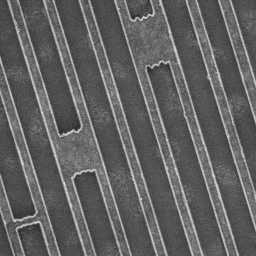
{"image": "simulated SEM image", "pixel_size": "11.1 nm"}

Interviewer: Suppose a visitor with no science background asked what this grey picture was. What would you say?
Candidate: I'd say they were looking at parallel lines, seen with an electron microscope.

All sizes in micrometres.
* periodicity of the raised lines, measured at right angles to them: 0.379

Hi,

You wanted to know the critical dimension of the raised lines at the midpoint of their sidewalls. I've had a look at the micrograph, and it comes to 109 nanometres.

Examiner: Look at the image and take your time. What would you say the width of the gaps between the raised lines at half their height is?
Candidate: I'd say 0.269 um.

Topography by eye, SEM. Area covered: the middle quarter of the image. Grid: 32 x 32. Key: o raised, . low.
oo.......oo.......oooo.....oo...
ooo......ooo......ooo......ooo..
ooo.......oo......ooo......ooo..
.oo.......oo.......oo.......oo..
.ooo......ooo......ooo......oo..
.ooo......ooo......ooo......ooo.
..oo.......oo.......oo......ooo.
..oo.......ooo......oo.......oo.
..ooo......ooo......ooo......ooo
...oo.......oo.......oo......ooo
...oo.......oo.......oo.......oo
...ooo......ooo......ooo......oo
...ooo......ooo......ooo......oo
....oo.......oo.......oo.......o
....ooo......ooo......ooo......o
....ooo......ooo......ooo......o
....ooo.......oo.......oo.......
oooooooo......ooo......ooo......
oooooooo......ooo......ooo......
oooooooo.......oo.......oo......
oooooooo.......ooo......oo......
ooooooooo......ooo......ooo.....
ooooooooo.......oo......ooo.....
oooooooooo......oo.......oo.....
oooooooooo......ooo......ooo....
oooooooooo......ooo......ooo....
oooooooooo.......oo.......oo....
ooo.....ooo......ooo......ooo...
oo......ooo......ooo......ooo...
oo.......oo.......oo.......oo...
ooo......oo.......ooo......oo...
ooo......ooo......ooo......ooo..